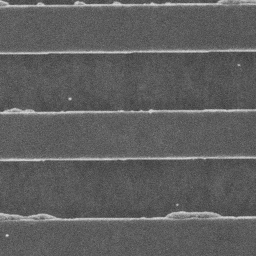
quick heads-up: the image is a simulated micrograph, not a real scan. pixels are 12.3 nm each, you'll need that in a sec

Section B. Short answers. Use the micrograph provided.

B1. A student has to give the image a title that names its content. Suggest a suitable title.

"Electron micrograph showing lines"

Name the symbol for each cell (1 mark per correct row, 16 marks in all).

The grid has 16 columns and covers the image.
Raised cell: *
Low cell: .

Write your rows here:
****************
****************
****************
................
................
................
................
****************
****************
****************
................
................
................
*.*.......****..
****************
****************